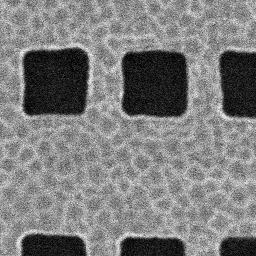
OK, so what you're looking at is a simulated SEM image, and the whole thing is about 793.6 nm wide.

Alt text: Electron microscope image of holes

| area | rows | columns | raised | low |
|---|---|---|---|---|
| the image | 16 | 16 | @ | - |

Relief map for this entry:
@@@@@@@@@@@@@@@@
@@@@@@@@@@@@@@@@
@@@@@@@@@@@@@@@@
@@---@@@---@@@--
@-----@@----@@--
@----@@@----@@--
@----@@@----@@--
@@@@@@@@@@@@@@@@
@@@@@@@@@@@@@@@@
@@@@@@@@@@@@@@@@
@@@@@@@@@@@@@@@@
@@@@@@@@@@@@@@@@
@@@@@@@@@@@@@@@@
@@@@@@@@@@@@@@@@
@@@@@@@@@@@@@@@@
@----@@@----@@--